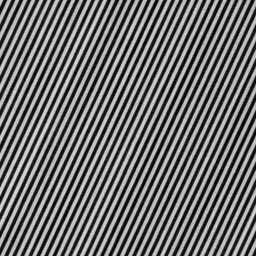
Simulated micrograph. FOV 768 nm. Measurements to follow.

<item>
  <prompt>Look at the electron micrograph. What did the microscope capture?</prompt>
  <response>parallel lines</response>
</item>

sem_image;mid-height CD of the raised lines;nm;10.9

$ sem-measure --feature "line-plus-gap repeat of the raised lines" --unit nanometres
21.7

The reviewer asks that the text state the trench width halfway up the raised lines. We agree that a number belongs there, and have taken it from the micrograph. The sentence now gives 10.9 nm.